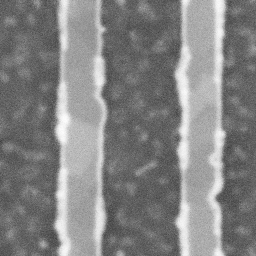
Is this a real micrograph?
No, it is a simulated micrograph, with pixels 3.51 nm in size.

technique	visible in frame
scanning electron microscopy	one or a few lines or trenches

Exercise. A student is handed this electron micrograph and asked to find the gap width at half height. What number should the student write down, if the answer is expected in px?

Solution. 79